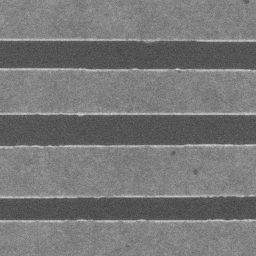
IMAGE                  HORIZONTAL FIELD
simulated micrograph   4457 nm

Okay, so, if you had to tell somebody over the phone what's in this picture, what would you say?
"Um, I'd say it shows lines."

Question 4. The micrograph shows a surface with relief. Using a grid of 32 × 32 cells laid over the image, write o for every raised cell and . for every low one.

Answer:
oooooooooooooooooooooooooooooooo
oooooooooooooooooooooooooooooooo
oooooooooooooooooooooooooooooooo
oooooooooooooooooooooooooooooooo
oooooooooooooooooooooooooooooooo
................................
................................
................................
................................
oooooooooooooooooooooooooooooooo
oooooooooooooooooooooooooooooooo
oooooooooooooooooooooooooooooooo
oooooooooooooooooooooooooooooooo
oooooooooooooooooooooooooooooooo
................................
................................
................................
................................
oooooooooooooooooooooooooooooooo
oooooooooooooooooooooooooooooooo
oooooooooooooooooooooooooooooooo
oooooooooooooooooooooooooooooooo
oooooooooooooooooooooooooooooooo
oooooooooooooooooooooooooooooooo
ooooooooooooooooooooooooo.......
................................
................................
................................
oooooooooooooooooooooooooooooooo
oooooooooooooooooooooooooooooooo
oooooooooooooooooooooooooooooooo
oooooooooooooooooooooooooooooooo